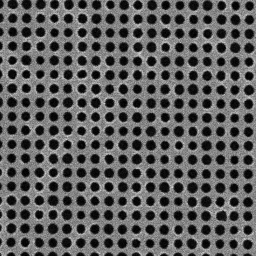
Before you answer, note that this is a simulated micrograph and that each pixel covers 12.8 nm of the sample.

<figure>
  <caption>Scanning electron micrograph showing a regular array of holes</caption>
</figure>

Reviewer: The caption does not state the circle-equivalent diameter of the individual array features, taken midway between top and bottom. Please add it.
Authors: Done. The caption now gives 9.9 pixels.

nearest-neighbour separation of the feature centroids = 0.174 micrometres